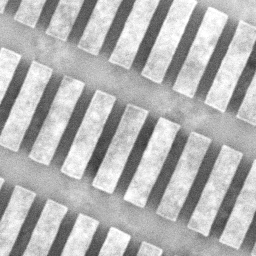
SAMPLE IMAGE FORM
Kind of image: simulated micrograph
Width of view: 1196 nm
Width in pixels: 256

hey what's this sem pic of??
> groups of lines, slits or small figures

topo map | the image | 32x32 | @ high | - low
@--@@--@@@--@@@--@@@--@@--------
--@@@--@@@--@@--@@@--@@@--@-----
--@@@-@@@--@@@--@@@--@@@-@@@----
------@@@--@@@--@@--@@@--@@@--@@
-------@--@@@--@@@--@@@--@@--@@@
----------@@@--@@--@@@--@@@--@@@
@@---------@--@@@--@@@--@@--@@@-
@@------------@@@-@@@--@@@--@@@-
@@--@@------------@@@--@@@--@@--
@--@@@------------@@--@@@--@@@--
@--@@@--@@------------@@@--@@--@
@-@@@--@@@--@---------@@--@@@--@
--@@@--@@@--@@------------@@@-@@
--@@--@@@--@@@--@----------@--@@
-@@@--@@@--@@--@@@------------@@
-@@@-@@@--@@@--@@@--@@----------
@@@--@@@--@@@--@@--@@@----------
@@@--@@--@@@--@@@--@@@--@@------
-@--@@@--@@@--@@--@@@--@@@--@---
----@@@--@@--@@@--@@@--@@--@@@--
--------@@@--@@@-@@@--@@@--@@@--
--------@@--@@@--@@@--@@@-@@@--@
------------@@@--@@--@@@--@@@--@
--@---------@@--@@@--@@@--@@@-@@
-@@@------------@@@--@@--@@@--@@
-@@@--@----------@--@@@--@@@-@@@
-@@--@@@------------@@--@@@--@@@
@@@--@@@--@@------------@@@--@@-
@@@-@@@--@@@------------@@--@@@-
@@--@@@--@@@-@@@------------@@@-
@@--@@--@@@--@@@--@---------@@--
@--@@@--@@@--@@--@@@------------